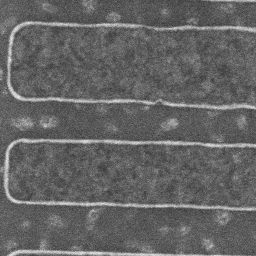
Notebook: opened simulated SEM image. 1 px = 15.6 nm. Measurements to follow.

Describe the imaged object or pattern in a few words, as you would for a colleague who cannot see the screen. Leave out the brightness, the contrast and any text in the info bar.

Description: one or a few lines or trenches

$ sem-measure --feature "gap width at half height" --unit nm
643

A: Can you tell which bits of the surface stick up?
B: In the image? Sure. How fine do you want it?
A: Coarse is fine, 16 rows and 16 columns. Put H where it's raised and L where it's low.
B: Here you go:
LLLLLLLLLLLLLLLL
LLHLLLLLLLLLLLLL
LHHHHHHHHHHHHHHH
LHHHHHHHHHHHHHHH
LHHHHHHHHHHHHHHH
LHHHHHHHHHHHHHHH
LLLLLLLLLLHHHHHH
LLLLLLLLLLLLLLLL
LLLLLLLLLLLLLLLL
LHHHHHHHHHHHHHHH
HHHHHHHHHHHHHHHH
HHHHHHHHHHHHHHHH
LHHHHHHHHHHHHHHH
LLLLLLLLLLLLLLLL
LLLLLLLLLLLLLLLL
LLLLLLLLLLLLLLLL